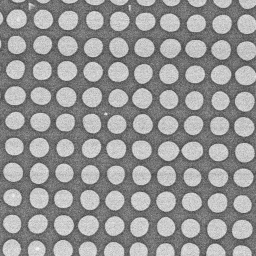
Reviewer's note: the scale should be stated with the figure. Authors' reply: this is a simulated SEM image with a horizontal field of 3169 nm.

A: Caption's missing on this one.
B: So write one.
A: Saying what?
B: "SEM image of an array of small figures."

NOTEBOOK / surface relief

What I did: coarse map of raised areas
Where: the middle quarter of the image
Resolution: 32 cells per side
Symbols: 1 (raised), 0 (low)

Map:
11100111100011100001100001110000
11100111110111110011110011110001
11100111110111110011110011110011
11000011100011110011110011110001
00000000000000000011100001110000
00000000000000000000000000000000
11000011100001000001100000000000
11100111100011110111110011110001
11100111100111110111110011110011
11100111100111110111110011110011
11000011000011000011100001110001
00000000000000000000000000000000
00000000000000000000000000000000
11000111100011100011100001100001
11100111100111100111110011110011
11000111100111100111110011110011
11000011100111100011110011110011
00000000000000000000000000000001
00000000000000000000000000000000
11000111100011100011000000100000
11000111100111100111110011110011
11000111100111100111110011111111
11000111000111100111110011110011
00000000000000000011100011110001
00000000000000000000000000000000
10000010000000000000000000000000
11000111100111100011100011100001
11001111100111100111110111110011
11001111100111100111110111110011
00000111000011000011100011110011
00000000000000000000000000000000
00000000000000000000000000000000